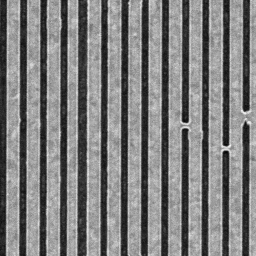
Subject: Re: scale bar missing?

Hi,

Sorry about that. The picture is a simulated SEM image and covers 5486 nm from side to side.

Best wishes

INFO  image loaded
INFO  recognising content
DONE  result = parallel lines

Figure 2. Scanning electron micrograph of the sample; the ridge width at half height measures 276 nanometres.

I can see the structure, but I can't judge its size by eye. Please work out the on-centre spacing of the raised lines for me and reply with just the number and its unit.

434 nanometres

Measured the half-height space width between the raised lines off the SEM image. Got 158 nm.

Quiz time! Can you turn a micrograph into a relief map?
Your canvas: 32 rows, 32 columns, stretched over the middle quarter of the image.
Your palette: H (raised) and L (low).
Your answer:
LHHLLLHHHLLHHHLLHHHLLHHHLLHHHLLH
LHHLLLHHHLLHHHLLHHHLLHHHLLHHHLLH
LHHLLLHHHLLHHHLLHHHLLHHHLLHHHLLH
LHHLLLHHHLLHHHLLHHHLLHHHLLHHHLLH
LHHLLLHHHLLHHHLLHHHLLHHHLLHHHLLH
LHHLLLHHHLLHHHLLHHHLLHHHLLHHHLLH
LHHLLLHHHLLHHHLLHHHLLHHHLLHHHLLH
LHHLLLHHHLLHHHLLHHHLLHHHLLHHHLLH
LHHLLLHHHLLHHHLLHHHLLHHHLLHHHLLH
LHHLLLHHHLLHHHLLHHHLLHHHLLHHHLLH
LHHLLLHHHLLHHHLLHHHLLHHHLLHHHLLH
LHHLLLHHHLLHHHLLHHHLLHHHLLHHHLLH
LHHLLLHHHLLHHHLLHHHLLHHHLLHHHLLH
LHHLLLHHHLLHHHLLHHHLLHHHLLHHHLLH
LHHLLLHHHLLHHHLLHHHLLHHHLLHHHLLH
LHHLLLHHHLLHHHLLHHHLLHHHLLHHHHHH
LHHLLLHHHLLHHHLLHHHLLHHHLLHHHLLH
LHHLLLHHHLLHHHLLHHHLLHHHLLHHHLLH
LHHLLLHHHLLHHHLLHHHLLHHHLLHHHLLH
LHHLLLHHHLLHHHLLHHHLLHHHLLHHHLLH
LHHLLLHHHLLHHHLLHHHLLHHHLLHHHLLH
LHHLLLHHHLLHHHLLHHHLLHHHLLHHHLLH
LHHLLLHHHLLHHHLLHHHLLHHHLLHHHLLH
LHHLLLHHHLLHHHLLHHHLLHHHLLHHHLLH
LHHLLLHHHLLHHHLLHHHLLHHHLLHHHLLH
LHHLLLHHHLLHHHLLHHHLLHHHLLHHHLLH
LHHLLLHHHLLHHHLLHHHLLHHHLLHHHLLH
LHHLLLHHHLLHHHLLHHHLLHHHLLHHHLLH
LHHLLLHHHLLHHHLLHHHLLHHHLLHHHLLH
LHHLLLHHHLLHHHLLHHHLLHHHLLHHHLLH
LHHLLLHHHLLHHHLLHHHLLHHHLLHHHLLL
LHHLLLHHHLLHHHLLHHHLLHHHLLHHHLLH